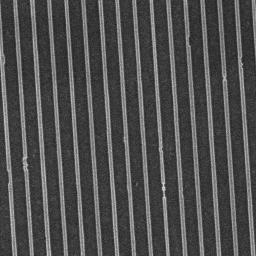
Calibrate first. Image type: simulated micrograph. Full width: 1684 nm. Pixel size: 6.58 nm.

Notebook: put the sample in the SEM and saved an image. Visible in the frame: parallel lines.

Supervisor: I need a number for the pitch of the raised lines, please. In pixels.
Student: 17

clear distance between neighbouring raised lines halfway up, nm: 90.2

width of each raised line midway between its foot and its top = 23.8 nm